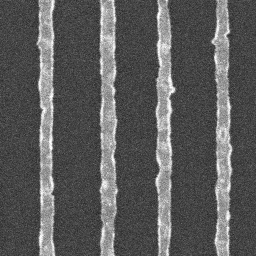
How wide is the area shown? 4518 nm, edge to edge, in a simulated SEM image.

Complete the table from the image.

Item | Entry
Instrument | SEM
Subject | parallel lines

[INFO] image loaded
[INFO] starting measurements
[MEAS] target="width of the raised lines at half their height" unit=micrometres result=0.203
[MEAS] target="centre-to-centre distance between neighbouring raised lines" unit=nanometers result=1040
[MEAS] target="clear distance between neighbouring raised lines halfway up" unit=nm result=841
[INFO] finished